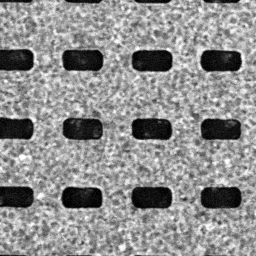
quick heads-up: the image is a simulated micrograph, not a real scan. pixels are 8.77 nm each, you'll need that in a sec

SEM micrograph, a regular array of holes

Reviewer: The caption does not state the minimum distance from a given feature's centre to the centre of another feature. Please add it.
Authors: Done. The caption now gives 601 nanometers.